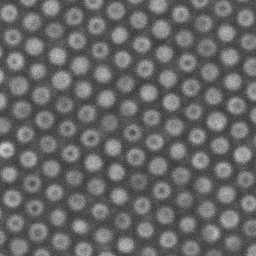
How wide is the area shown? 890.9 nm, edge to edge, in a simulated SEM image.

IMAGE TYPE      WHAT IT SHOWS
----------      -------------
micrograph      a regular array of raised bodies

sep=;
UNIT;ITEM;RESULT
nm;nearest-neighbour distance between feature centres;84.4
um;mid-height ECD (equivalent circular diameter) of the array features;0.0519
